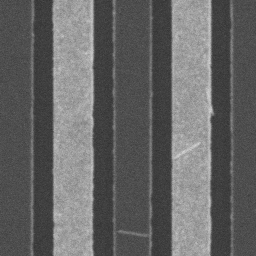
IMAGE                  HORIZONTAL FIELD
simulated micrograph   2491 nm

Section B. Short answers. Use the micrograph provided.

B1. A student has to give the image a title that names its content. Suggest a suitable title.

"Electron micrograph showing lines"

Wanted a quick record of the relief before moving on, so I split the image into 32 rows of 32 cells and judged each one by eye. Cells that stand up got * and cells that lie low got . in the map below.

****...*****..*****...****...***
****...*****..*****...****...***
****...*****..*****...****...***
****...*****..*****...****...***
****...*****..*****...****...***
****...*****..*****...****...***
****...*****..*****...****...***
****...*****..*****...****...***
****...*****..*****...****...***
****...*****..*****...****...***
****...*****..*****...****...***
****...*****..*****...****...***
****...*****..*****...****...***
****...*****..*****...****...***
****...*****..*****...****...***
****...*****..*****...****...***
****...****...*****...****...***
****...****...*****...****...***
****...*****..*****...****...***
****...*****..*****...****...***
****...*****..*****...****...***
****...*****..*****...****...***
****...*****..*****...****...***
****...*****..*****...****...***
****...*****..*****...****...***
****...*****..*****...****...***
****...****...*****...****...***
****...****...*****...****...***
****...****...*****...****...***
****...****...*****...****...***
****...****...*****...****...***
****...*****..*****...****...***